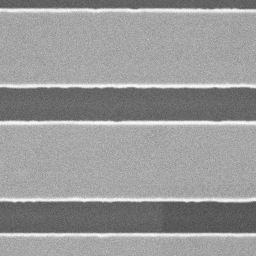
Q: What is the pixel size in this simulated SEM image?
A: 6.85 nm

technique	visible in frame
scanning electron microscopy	lines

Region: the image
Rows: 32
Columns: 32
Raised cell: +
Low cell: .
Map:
................................
++++++++++++++++++++++++++++++++
++++++++++++++++++++++++++++++++
++++++++++++++++++++++++++++++++
++++++++++++++++++++++++++++++++
++++++++++++++++++++++++++++++++
++++++++++++++++++++++++++++++++
++++++++++++++++++++++++++++++++
++++++++++++++++++++++++++++++++
++++++++++++++++++++++++++++++++
++++++++++++++++++++++++++++++++
................................
................................
................................
................................
++++++++++++++++++++++++++++++++
++++++++++++++++++++++++++++++++
++++++++++++++++++++++++++++++++
++++++++++++++++++++++++++++++++
++++++++++++++++++++++++++++++++
++++++++++++++++++++++++++++++++
++++++++++++++++++++++++++++++++
++++++++++++++++++++++++++++++++
++++++++++++++++++++++++++++++++
++++++++++++++++++++++++++++++++
................................
................................
................................
................................
++++++++++++++++++++++++++++++++
++++++++++++++++++++++++++++++++
++++++++++++++++++++++++++++++++